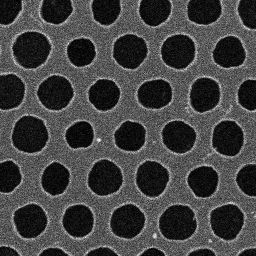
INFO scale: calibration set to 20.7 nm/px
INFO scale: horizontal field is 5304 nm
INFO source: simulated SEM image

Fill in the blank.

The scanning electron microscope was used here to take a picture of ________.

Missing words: a regular array of holes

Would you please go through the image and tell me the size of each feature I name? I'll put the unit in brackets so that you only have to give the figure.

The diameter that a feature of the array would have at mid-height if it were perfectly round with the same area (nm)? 697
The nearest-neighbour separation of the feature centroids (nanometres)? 994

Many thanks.